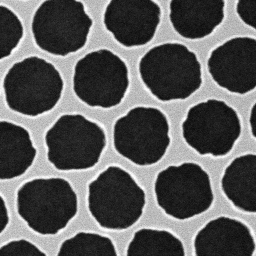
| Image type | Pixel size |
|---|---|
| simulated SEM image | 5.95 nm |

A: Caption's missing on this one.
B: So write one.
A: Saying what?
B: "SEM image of a regular array of holes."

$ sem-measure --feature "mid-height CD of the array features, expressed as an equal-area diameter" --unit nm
346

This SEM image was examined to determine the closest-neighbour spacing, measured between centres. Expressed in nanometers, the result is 407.